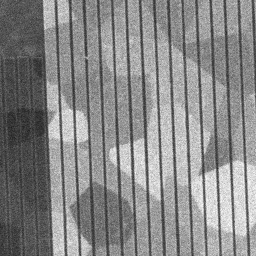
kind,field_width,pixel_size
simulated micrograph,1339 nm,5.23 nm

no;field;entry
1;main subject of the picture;parallel lines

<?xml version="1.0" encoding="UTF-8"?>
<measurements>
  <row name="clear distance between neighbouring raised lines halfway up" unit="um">0.0203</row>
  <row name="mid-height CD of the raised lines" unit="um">0.0536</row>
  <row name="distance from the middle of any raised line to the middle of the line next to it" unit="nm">73.6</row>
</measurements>